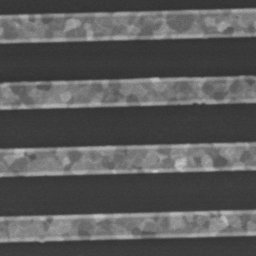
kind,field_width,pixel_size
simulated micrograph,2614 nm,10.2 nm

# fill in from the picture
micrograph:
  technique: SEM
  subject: one or a few lines or trenches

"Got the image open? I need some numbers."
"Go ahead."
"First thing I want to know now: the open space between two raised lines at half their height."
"43 pixels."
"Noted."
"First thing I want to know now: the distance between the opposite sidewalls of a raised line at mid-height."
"23.5 pixels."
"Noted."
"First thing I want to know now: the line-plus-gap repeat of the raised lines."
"681 nm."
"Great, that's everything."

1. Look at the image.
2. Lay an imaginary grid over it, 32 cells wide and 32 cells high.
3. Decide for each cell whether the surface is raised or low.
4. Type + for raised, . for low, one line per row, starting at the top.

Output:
................................
..........................++++++
++++++++++++++++++++++++++++++++
++++++++++++++++++++++++++++++++
++++++++++++++++++++++++.+......
................................
................................
................................
................................
................................
.+++++++++++++++++++++++++++++++
++++++++++++++++++++++++++++++++
++++++++++++++++++++++++++++++++
.+..............................
................................
................................
................................
................................
.............+..++++++++++++++++
++++++++++++++++++++++++++++++++
++++++++++++++++++++++++++++++++
++++++++++++++..................
................................
................................
................................
................................
................................
++++++++++++++++++++++++++++++++
++++++++++++++++++++++++++++++++
+++++++++++++++++++++...........
................................
................................